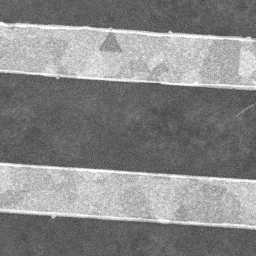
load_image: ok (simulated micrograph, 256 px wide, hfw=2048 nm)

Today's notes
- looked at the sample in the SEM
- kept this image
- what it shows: one or a few lines or trenches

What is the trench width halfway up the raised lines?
740 nm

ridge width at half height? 363 nm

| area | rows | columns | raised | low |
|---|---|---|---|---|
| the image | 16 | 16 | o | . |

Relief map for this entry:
................
................
ooooooooooooooo.
oooooooooooooooo
.ooooooooooooooo
................
................
................
................
................
ooo.............
oooooooooooooooo
oooooooooooooooo
......oooooooooo
................
................